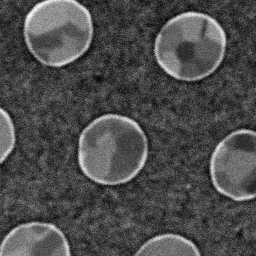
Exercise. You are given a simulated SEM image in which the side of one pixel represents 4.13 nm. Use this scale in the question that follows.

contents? raised bodies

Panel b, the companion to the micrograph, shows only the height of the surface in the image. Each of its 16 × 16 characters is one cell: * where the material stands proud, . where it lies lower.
..***...........
..****....****..
..****....****..
..***.....****..
...........**...
................
................
*.....**........
*....****.....**
*....****....***
.....****....***
.............***
................
................
.***............
****.....***....